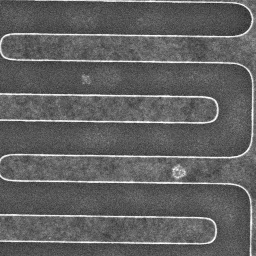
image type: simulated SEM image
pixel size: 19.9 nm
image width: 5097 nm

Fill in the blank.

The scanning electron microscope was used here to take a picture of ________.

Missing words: groups of lines, slits or small figures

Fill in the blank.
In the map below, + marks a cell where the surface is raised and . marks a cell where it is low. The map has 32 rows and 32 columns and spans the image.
..............................++
...............................+
................................
...............................+
.++++++++++++++++++++++......+++
++++++++++++++++++++++++++++++++
++++++++++++++++++++++++++++++++
...+++++++++++++++++++++++++++++
...............................+
...............................+
................................
................................
+++++++++++++++++++++++++++.....
+++++++++++++++++++++++++++.....
+++++++++++++++++++++++++++.....
................................
................................
...............................+
...............................+
.++++++++++++.................++
++++++++++++++++++++++++++++++++
++++++++++++++++++++++++++++++++
..++++++++++++++++++++++++++++++
..............................++
...............................+
...............................+
...............................+
++++++++++++++++++++++++++.....+
+++++++++++++++++++++++++++....+
+++++++++++++++++++++++++++....+
...............................+
...............................+